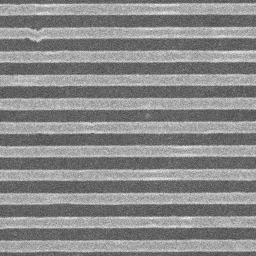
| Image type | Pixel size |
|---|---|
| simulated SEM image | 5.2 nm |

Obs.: parallel lines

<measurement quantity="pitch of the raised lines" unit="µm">0.123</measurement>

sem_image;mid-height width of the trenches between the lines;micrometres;0.0643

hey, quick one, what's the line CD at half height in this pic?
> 59.1 nm